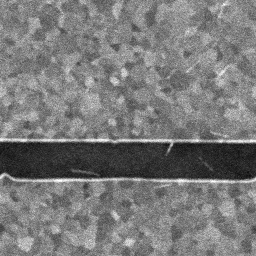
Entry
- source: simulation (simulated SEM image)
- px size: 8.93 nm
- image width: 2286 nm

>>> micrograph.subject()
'one or a few lines or trenches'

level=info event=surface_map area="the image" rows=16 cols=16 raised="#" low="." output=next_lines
################
################
################
################
################
################
################
################
################
................
................
################
################
################
################
################